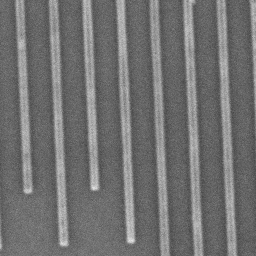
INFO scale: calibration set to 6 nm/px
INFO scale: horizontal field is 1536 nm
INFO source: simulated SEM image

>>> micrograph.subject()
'parallel lines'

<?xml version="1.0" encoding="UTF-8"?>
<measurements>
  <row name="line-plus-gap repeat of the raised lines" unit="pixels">33.5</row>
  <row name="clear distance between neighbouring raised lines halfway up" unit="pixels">27.2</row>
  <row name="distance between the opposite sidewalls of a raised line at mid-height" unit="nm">36.7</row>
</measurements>